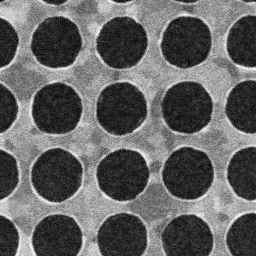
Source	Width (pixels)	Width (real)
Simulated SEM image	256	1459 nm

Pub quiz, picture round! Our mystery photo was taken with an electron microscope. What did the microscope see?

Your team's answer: a regular array of holes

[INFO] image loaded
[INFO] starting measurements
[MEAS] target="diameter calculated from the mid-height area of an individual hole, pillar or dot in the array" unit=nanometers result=307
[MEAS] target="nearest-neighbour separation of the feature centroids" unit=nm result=371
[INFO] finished